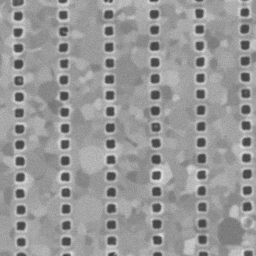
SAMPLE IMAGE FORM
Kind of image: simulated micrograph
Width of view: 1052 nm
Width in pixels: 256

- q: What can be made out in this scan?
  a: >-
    a regular array of holes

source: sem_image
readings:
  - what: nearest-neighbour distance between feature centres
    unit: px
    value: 16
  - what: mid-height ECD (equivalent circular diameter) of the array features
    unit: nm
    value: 44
